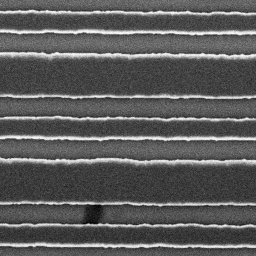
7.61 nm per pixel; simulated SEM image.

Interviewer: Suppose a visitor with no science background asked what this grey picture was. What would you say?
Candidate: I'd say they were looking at lines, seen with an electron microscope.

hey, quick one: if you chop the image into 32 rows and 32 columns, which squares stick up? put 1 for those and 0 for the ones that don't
00000000000000000000000000000000
11111111100011110000100000000000
11111111111111111111111111111111
11111111111111111111111111111111
00000000000000000000000000000000
00000000000000000000000000000000
00000000000000000000000000000000
11111111111111111111111111111111
11111111111111111111111111111111
11111111111111111111111111111111
11111111111111111111111111111111
11111111111111111111111111111111
00000000000000000000000000000000
00000000000000000000000000000000
00000000000000000000000000000000
11111111111111111111111111111111
11111111111111111111111111111111
00000000000000000000000000000000
00000000000000000000000000000000
00000000000000000000000000000000
11111111111111111111111111111111
11111111111111111111111111111111
11111111111111111111111111111111
11111111111111111111111111111111
11111111111111111111111111111111
00000000000000000111111111111111
00000000000000000000000000000000
00000000000000000000000000000000
11111111111111111111111111111111
11111111111111111111111111111111
11111111111111111111111111111111
00000000000000000000000000000000